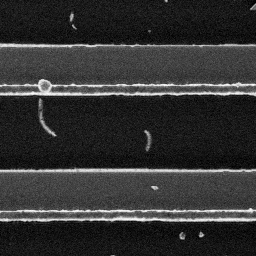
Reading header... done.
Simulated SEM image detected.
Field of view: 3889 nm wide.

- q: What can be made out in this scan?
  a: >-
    lines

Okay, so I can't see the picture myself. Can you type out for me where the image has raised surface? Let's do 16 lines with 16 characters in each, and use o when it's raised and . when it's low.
................
................
................
oooooooooooooooo
oooooooooooooooo
oooooooooooooooo
................
................
................
................
................
oooooooooooooooo
oooooooooooooooo
oooooooooooooooo
................
................